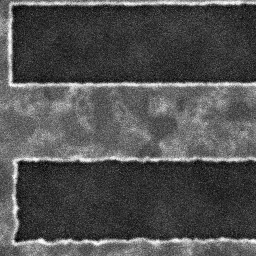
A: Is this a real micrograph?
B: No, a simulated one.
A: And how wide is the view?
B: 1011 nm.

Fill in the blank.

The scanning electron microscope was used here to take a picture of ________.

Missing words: one or a few lines or trenches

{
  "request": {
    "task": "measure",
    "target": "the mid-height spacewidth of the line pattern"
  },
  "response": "319 nanometres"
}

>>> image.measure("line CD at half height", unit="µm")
0.299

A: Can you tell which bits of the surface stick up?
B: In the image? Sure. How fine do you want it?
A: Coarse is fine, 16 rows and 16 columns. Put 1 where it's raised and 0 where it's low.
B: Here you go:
1000000000000000
1000000000000000
1000000000000000
1000000000000000
1000000000000000
1111111111111111
1111111111111111
1111111111111111
1111111111111111
1111111111111111
1000000000000000
1000000000000000
1000000000000000
1000000000000000
1000000000000000
1111111111111111